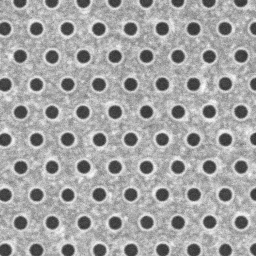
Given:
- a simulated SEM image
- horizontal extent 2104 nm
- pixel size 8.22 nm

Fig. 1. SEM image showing a regular array of holes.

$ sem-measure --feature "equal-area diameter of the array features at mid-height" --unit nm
122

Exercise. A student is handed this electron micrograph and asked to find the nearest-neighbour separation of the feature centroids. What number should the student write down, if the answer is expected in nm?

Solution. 257